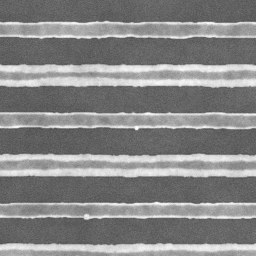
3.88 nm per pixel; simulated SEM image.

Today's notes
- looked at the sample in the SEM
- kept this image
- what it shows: lines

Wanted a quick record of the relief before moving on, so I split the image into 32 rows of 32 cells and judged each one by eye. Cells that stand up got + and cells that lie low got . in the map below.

................................
................................
................................
++++++++++++++++++++++++++++++++
++++++++++++++++++++++++++++++++
................................
................................
................................
++++++++++++++++++++++++++++++++
++++++++++++++++++++++++++++++++
+++++.........+.+++++++.++++++++
................................
................................
................................
++++++++++++++++++++++++++++++++
++++++++++++++++++++++++++++++++
................................
................................
................................
...+............................
++++++++++++++++++++++++++++++++
++++++++++++++++++++++++++++++++
................................
................................
................................
.+++++++++++++++++++++++++++++++
++++++++++++++++++++++++++++++++
................................
................................
................................
................................
++++++++++++++++++++++++++++++++